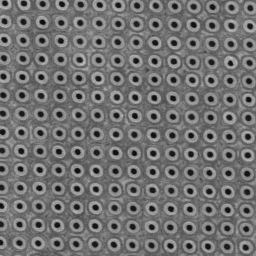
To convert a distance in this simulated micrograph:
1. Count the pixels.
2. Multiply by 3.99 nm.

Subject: a regular array of ring-shaped raised bodies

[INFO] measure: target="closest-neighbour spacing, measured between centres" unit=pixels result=18.2